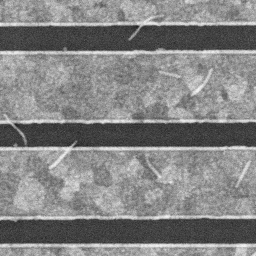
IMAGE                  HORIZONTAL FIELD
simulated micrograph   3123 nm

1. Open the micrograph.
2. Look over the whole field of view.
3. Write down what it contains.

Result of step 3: lines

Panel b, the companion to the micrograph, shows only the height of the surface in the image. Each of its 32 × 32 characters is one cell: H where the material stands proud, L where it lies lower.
HHHHHHHHHHHHHHHHHHHHHHHHHHHHHHHH
HHHHHHHHHHHHHHHHHHHHHHHHHHHHHHHH
HHHHHHHHHHHHHHHHHHHHHHHHHHHHHHHH
LLLLLLLLLLLLLLLLLLLLLLLLLLLLLLLL
LLLLLLLLLLLLLLLLLLLLLLLLLLLLLLLL
LLLLLLLLLLLLLLLLLLLLLLLLLLLLLLLL
LLLLLLLLLLLLLLLLLLLLLLHHLLHHHHHH
HHHHHHHHHHHHHHHHHHHHHHHHHHHHHHHH
HHHHHHHHHHHHHHHHHHHHHHHHHHHHHHHH
HHHHHHHHHHHHHHHHHHHHHHHHHHHHHHHH
HHHHHHHHHHHHHHHHHHHHHHHHHHHHHHHH
HHHHHHHHHHHHHHHHHHHHHHHHHHHHHHHH
HHHHHHHHHHHHHHHHHHHHHHHHHHHHHHHH
HHHHHHHHHHHHHHHHHHHHHHHHHHHHHHHH
HHHHHHHHHHHHHHHHHHHHHHHHHHHHHHHH
LLLLLLLLLLLLLLLLLLLLLLLLLLLLLLLL
LLLLLLLLLLLLLLLLLLLLLLLLLLLLLLLL
LLLLLLLLLLLLLLLLLLLLLLLLLLLLLLLL
LLLLLLLLHLLLLLLLLLLLLLLLLLLLLLLL
HHHHHHHHHHHHHHHHHHHHHHHHHHHHHHHH
HHHHHHHHHHHHHHHHHHHHHHHHHHHHHHHH
HHHHHHHHHHHHHHHHHHHHHHHHHHHHHHHH
HHHHHHHHHHHHHHHHHHHHHHHHHHHHHHHH
HHHHHHHHHHHHHHHHHHHHHHHHHHHHHHHH
HHHHHHHHHHHHHHHHHHHHHHHHHHHHHHHH
HHHHHHHHHHHHHHHHHHHHHHHHHHHHHHHH
HHHHHHHHHHHHHHHHHHHHHHHHHHHHHHHH
LLLLLLLLLLLLLLLLLLLLLLLLLLLLLLLL
LLLLLLLLLLLLLLLLLLLLLLLLLLLLLLLL
LLLLLLLLLLLLLLLLLLLLLLLLLLLLLLLL
LLLLLLLLLLLLLLLLLLLLLLLLLLLLLLLL
HHHHHHHHHHHHHHHHHHHHHHHHHHHHHHHH